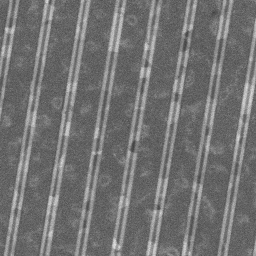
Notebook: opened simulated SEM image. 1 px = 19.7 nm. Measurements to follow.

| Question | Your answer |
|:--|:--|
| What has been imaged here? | parallel lines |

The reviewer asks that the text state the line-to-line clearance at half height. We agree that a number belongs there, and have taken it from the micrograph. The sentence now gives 0.55 microns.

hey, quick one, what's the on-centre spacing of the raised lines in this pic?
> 694 nanometers